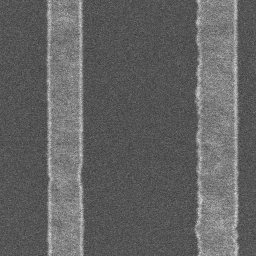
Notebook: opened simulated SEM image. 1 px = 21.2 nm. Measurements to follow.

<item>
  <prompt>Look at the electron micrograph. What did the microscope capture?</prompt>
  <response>one or a few lines or trenches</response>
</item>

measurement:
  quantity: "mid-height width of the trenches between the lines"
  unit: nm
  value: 2520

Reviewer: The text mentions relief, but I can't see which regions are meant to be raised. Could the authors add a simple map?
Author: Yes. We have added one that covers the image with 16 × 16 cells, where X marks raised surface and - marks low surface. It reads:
---XX-------XXX-
---XX-------XXX-
---XX-------XXX-
---XX--------XX-
---XX-------XXX-
---XX-------XXX-
---XX-------XXX-
---XX-------XXX-
---XX-------XXX-
---XX-------XXX-
---XX-------XXX-
---XX-------XXX-
---XX-------XXX-
---XX-------XXX-
---XX-------XXX-
---XX--------XX-